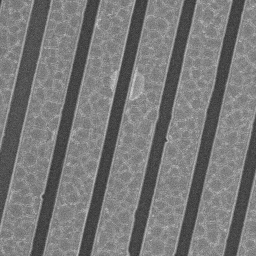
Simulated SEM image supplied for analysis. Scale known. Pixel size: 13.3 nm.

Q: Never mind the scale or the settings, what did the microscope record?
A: parallel lines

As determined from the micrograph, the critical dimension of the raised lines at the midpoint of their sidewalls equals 34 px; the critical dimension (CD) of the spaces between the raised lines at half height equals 0.172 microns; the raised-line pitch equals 0.628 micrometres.